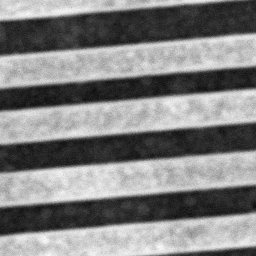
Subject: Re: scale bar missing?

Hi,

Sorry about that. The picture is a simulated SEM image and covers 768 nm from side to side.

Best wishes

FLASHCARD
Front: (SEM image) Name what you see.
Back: one or a few lines or trenches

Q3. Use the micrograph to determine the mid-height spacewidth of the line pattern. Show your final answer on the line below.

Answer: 31.8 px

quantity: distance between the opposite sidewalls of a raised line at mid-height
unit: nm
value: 89.8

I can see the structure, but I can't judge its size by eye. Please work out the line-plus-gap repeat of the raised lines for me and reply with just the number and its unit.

178 nm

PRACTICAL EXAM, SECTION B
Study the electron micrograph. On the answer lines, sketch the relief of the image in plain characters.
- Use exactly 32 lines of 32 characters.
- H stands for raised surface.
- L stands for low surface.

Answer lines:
HHHHHHHHHHHHHHHHHHHHHLLLLLLLLLLL
HHHHHHHHHHLLLLLLLLLLLLLLLLLLLLLL
LLLLLLLLLLLLLLLLLLLLLLLLLLLLLLLL
LLLLLLLLLLLLLLLLLLLLLLLLLLLLLLLL
LLLLLLLLLLLLLLLLLLLLLLLLLLLLLLLH
LLLLLLLLLLLLLLLLLLLHHHHHHHHHHHHH
LLLLLLLLHHHHHHHHHHHHHHHHHHHHHHHH
HHHHHHHHHHHHHHHHHHHHHHHHHHHHHHHH
HHHHHHHHHHHHHHHHHHHHHHHHHHLLLLLL
HHHHHHHHHHHHHHHHLLLLLLLLLLLLLLLL
HHHLLLLLLLLLLLLLLLLLLLLLLLLLLLLL
LLLLLLLLLLLLLLLLLLLLLLLLLLLLLLHH
LLLLLLLLLLLLLLLLLLHHHHHHHHHHHHHH
LLLLLLLHHHHHHHHHHHHHHHHHHHHHHHHH
HHHHHHHHHHHHHHHHHHHHHHHHHHHHHHHH
HHHHHHHHHHHHHHHHHHHHHHHHHHLLLLLL
HHHHHHHHHHHHHHHLLLLLLLLLLLLLLLLL
HHHHLLLLLLLLLLLLLLLLLLLLLLLLLLLL
LLLLLLLLLLLLLLLLLLLLLLLLLLLLLLLL
LLLLLLLLLLLLLLLLLLLLLLLLLLLHHHHH
LLLLLLLLLLLLLLLHHHHHHHHHHHHHHHHH
LLLLHHHHHHHHHHHHHHHHHHHHHHHHHHHH
HHHHHHHHHHHHHHHHHHHHHHHHHHHHHHHH
HHHHHHHHHHHHHHHHHHHHHHHHHLLLLLLL
HHHHHHHHHHHHHLLLLLLLLLLLLLLLLLLL
HHLLLLLLLLLLLLLLLLLLLLLLLLLLLLLL
LLLLLLLLLLLLLLLLLLLLLLLLLLLLLLLL
LLLLLLLLLLLLLLLLLLLLLLLLLHHHHHHH
LLLLLLLLLLLLLHHHHHHHHHHHHHHHHHHH
LLHHHHHHHHHHHHHHHHHHHHHHHHHHHHHH
HHHHHHHHHHHHHHHHHHHHHHHHHHHHHHHH
HHHHHHHHHHHHHHHHHHHHHHLLLLLLLLLL